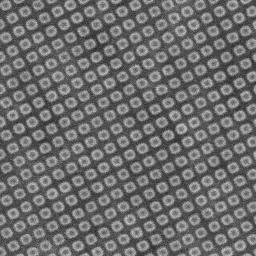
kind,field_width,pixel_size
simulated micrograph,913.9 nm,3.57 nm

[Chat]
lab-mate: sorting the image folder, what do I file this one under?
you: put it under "a regular array of raised bodies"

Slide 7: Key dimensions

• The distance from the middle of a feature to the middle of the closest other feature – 51.1 nm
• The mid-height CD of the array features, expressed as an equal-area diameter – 36.1 nm